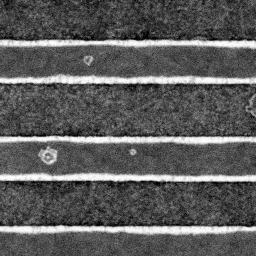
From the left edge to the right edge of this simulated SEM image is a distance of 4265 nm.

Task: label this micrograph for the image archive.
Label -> lines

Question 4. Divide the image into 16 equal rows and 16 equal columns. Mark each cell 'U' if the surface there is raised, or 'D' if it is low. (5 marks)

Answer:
DDDDDDDDDDDDDDDD
DDDDDDDDDDDDDDDD
DDDDDDDDDDDDDDDD
UUUUUUUUUUUUUUUU
UUUUUUUUUUUUUUUU
DDDDDDDDDDDDDDDD
DDDDDDDDDDDDDDDD
DDDDDDDDDDDDDDDD
DDDDDDDDDDDDDDDD
UUUUUUUUUUUUUUUU
UUUUUUUUUUUUUUUU
DDDDDDDDDDDDDDDD
DDDDDDDDDDDDDDDD
DDDDDDDDDDDDDDDD
UUUUUUUUUUUUUUUU
UUUUUUUUUUUUUUUU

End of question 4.